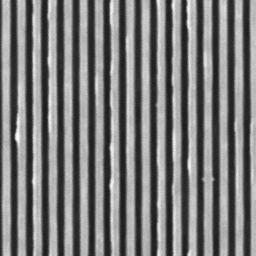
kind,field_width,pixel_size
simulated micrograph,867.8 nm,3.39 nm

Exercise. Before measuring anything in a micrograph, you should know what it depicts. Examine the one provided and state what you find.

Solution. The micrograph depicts parallel lines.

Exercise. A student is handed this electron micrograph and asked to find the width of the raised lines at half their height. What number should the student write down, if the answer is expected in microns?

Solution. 0.0296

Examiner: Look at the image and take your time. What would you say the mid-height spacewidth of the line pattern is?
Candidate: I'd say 6.99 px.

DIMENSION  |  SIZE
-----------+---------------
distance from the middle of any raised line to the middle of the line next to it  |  52.6 nm